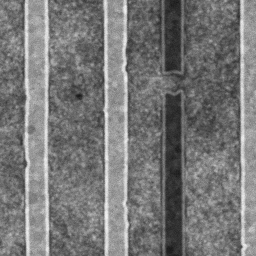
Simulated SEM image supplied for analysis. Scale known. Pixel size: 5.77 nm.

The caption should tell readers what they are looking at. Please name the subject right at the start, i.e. one or a few lines or trenches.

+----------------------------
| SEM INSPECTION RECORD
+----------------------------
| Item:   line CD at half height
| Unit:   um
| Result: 0.114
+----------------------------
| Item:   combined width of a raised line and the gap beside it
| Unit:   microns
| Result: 0.395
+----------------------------